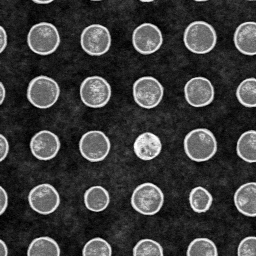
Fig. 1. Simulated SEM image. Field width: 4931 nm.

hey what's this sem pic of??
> a regular array of raised bodies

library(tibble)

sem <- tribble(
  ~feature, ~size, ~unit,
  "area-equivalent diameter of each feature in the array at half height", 567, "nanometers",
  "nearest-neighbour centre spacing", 1000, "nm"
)